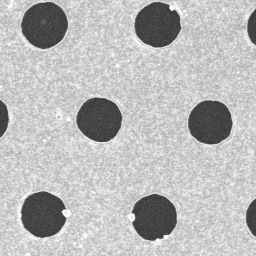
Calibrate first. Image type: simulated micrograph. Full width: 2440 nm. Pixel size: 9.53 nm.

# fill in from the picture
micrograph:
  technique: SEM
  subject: holes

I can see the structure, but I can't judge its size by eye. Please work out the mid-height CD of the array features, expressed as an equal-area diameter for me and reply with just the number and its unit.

45.8 px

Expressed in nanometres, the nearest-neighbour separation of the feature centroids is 1050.